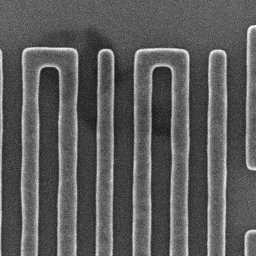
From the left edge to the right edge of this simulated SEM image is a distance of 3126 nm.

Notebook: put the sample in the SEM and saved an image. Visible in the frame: wiring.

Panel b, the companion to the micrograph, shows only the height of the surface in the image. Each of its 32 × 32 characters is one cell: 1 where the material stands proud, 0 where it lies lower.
00000000000000000000000000000000
00000000000000000000000000000000
00000000000000000000000000000000
00000000000000000000000000000001
00000000000000000000000000000001
00000000000000000000000000000001
00011111110011000111111000010001
00011111110011000111111100110001
00011101110011000111011100110001
00011001110011000110001100110001
00011001110011000110001100110001
00011001110011000110001100110001
00011001110011000110001100110001
00011001110011000110001100110001
00011001110011000110011100110001
00011001110011000110011100110001
00011001110011000110011100110001
00011001110011000110011100110001
00011001110011000110011100110001
00011001110011000110001100110001
00011001110011000110001100110001
00011001110011000110011100110000
00011001110011000110011100110000
00011001110011000110011000110000
00011001110011000110011000110000
00011001110011000110011000110000
00011001110011000110011000110000
00011001110011000110011000110000
00011001110011000110011000110000
00011001110011000110011000110001
00011001110011000110011000110001
00011001110011000110011000110001